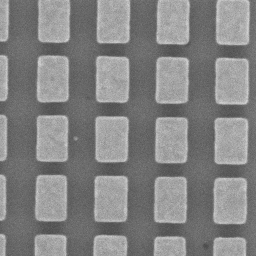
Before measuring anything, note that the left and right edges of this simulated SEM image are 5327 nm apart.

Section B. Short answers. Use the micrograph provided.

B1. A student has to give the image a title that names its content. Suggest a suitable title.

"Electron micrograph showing wiring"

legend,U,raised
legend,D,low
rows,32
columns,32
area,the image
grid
UDDDDUUUUDDDUUUUDDDDUUUUDDDUUUUD
UDDDDUUUUDDDUUUUDDDDUUUUDDDUUUUD
UDDDDUUUUDDDUUUUDDDDUUUUDDDUUUUD
UDDDDUUUUDDDUUUUDDDDUUUUDDDUUUUD
UDDDDUUUUDDDUUUUDDDDUUUUDDDUUUUD
DDDDDDDDDDDDDDDDDDDDDDUDDDDDUUUD
DDDDDDDDDDDDDDDDDDDDDDDDDDDDDDDD
UDDDDUUUDDDDUUUUDDDDUUUDDDDUUUUD
UDDDDUUUDDDDUUUUDDDDUUUDDDDUUUUD
UDDDDUUUDDDDUUUUDDDDUUUDDDDUUUUD
UDDDDUUUDDDDUUUUDDDDUUUDDDDUUUUD
UDDDDUUUDDDDUUUUDDDDUUUDDDDUUUUD
DDDDDUUUDDDDUUUUDDDDUUUDDDDUUUUD
DDDDDDDDDDDDDDDDDDDDDDDDDDDDDDDD
DDDDDUUUDDDDDDDDDDDDDDDDDDDDDDDD
UDDDDUUUDDDDUUUUDDDDUUUDDDDUUUUD
UDDDDUUUDDDDUUUUDDDDUUUDDDDUUUUD
UDDDDUUUDDDDUUUUDDDUUUUDDDDUUUUD
UDDDDUUUDDDDUUUUDDDUUUUDDDDUUUUD
UDDDDUUUDDDDUUUUDDDUUUUDDDDUUUUD
DDDDDDDDDDDDDDDDDDDDDDDDDDDDUUDD
DDDDDDDDDDDDDDDDDDDDDDDDDDDDDDDD
UDDDDUUUDDDDUUUUDDDDUUUDDDDUUUDD
UDDDDUUUDDDDUUUUDDDUUUUDDDDUUUUD
UDDDDUUUDDDDUUUUDDDUUUUDDDDUUUUD
UDDDUUUUDDDDUUUUDDDUUUUDDDDUUUUD
UDDDUUUUDDDDUUUUDDDUUUUDDDDUUUUD
DDDDDUUUDDDDUUUUDDDDUUUDDDDUUUUD
DDDDDDDDDDDDDDDDDDDDDDDDDDDDDDDD
DDDDDUUUDDDDUUUDDDDDDDDDDDDDDDDD
UDDDUUUUDDDDUUUUDDDUUUUDDDDUUUUD
UDDDUUUUDDDDUUUUDDDUUUUDDDDUUUUD